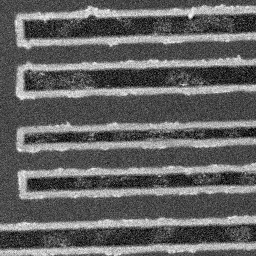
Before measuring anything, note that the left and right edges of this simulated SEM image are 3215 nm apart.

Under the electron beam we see parallel lines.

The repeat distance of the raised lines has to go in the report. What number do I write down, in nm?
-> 650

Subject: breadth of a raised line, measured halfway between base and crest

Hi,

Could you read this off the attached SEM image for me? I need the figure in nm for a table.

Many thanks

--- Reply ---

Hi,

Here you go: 383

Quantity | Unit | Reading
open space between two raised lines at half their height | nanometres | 306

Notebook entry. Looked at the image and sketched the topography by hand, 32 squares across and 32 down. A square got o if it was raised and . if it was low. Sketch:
oooooooooooooooooooooooooooooooo
oooooooooooooooooooooooo........
ooo.............................
oo..............................
oo............................oo
oooooooooooooooooooooooooooooooo
oooooooooooooooooooooooooooooooo
oooooooooooooooooooooooooooooooo
ooo.o...........................
ooo.............................
ooo.............................
ooo........ooooooooooooooooooooo
oooooooooooooooooooooooooooooooo
oooooooooooooooooooooooooooooooo
oooooooooooooooooooooooooooooooo
ooooooooooooooooooooooooooooooo.
ooo.............................
ooo.............................
oooooooooooooooooooooooooooooooo
oooooooooooooooooooooooooooooooo
oooooooooooooooooooooooooooooooo
oooooooooooooo.o................
ooo.............................
ooo.............................
oooooooooooooooooooooooooooooooo
oooooooooooooooooooooooooooooooo
oooooooooooooooooooooooooooooooo
oooooooooooooooooooooooooooooooo
................................
................................
................................
...ooooooooooooooooooooooooooooo